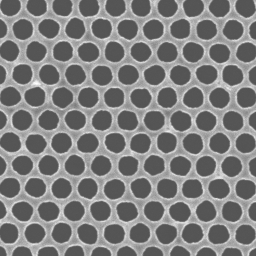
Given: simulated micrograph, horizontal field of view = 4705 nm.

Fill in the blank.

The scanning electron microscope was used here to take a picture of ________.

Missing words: a regular array of holes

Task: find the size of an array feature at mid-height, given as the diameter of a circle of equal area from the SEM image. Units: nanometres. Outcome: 381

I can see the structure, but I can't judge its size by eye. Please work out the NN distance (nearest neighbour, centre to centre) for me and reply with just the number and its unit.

470 nm